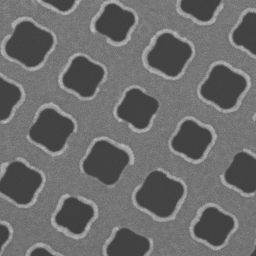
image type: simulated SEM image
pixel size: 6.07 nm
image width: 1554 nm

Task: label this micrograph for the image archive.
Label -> a regular array of holes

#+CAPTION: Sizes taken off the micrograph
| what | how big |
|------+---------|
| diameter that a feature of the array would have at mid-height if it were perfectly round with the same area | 238 nanometers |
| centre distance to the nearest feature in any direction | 378 nm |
